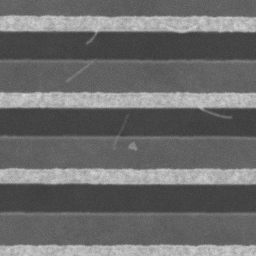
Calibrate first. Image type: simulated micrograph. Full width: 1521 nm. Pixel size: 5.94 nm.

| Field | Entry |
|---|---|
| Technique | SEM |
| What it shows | lines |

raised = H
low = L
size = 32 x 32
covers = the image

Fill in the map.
HHHHHHHHHHHHHHHHHHHHHHHHHHHHHHHH
HHHHHHHHHHHHHHHHHHHHHHHHHHHHHHHH
HHHHHHHHHHHHHHHHHHHHHHHHHHHHHHHH
HHHHHHHHHHHHHHHHHHHHHHHHHHHHHHHH
LLLLLLLLLLLLLLLLLLLLLLLLLLLLLLLL
LLLLLLLLLLLLLLLLLLLLLLLLLLLLLLLL
LLLLLLLLLLLLLLLLLLLLLLLLLLLLLLLL
LLLLLLLLLLLLLLLLLLLLLLLLLLLLLLLL
HHHHHHHHHHHHHHHHHHHHHHHHHHHHHHHH
HHHHHHHHHHHHHHHHHHHHHHHHHHHHHHHH
HHHHHHHHHHHHHHHHHHHHHHHHHHHHHHHH
HHHHHHHHHHHHHHHHHHHHHHHHHHHHHHHH
HHHHHHHHHHHHHHHHHHHHHHHHHHHHHHHH
LLLLLLLLLLLLLLLLLLLLLLLLLHLLLLLL
LLLLLLLLLLLLLLLLLLLLLLLLLLLLLLLL
LLLLLLLLLLLLLLLLLLLLLLLLLLLLLLLL
LLLLLLLLLLLLLLLLLLLLLLLLLLLLLLLL
HHHHHHHHHHHHHHHHHHHHHHHHHHHHHHHH
HHHHHHHHHHHHHHHHHHHHHHHHHHHHHHHH
HHHHHHHHHHHHHHHHHHHHHHHHHHHHHHHH
HHHHHHHHHHHHHHHHHHHHHHHHHHHHHHHH
HHHHHHHHHHHHHHHHHHHHHHHHHHHHHHHH
HHHHHHHHHHHHHHHHHHHHHHHHHHHHHHHH
LLLLLLLLLLLLLLLLLLLLLLLLLLLLLLLL
LLLLLLLLLLLLLLLLLLLLLLLLLLLLLLLL
LLLLLLLLLLLLLLLLLLLLLLLLLLLLLLLL
LLLLLLLLLLLLLLLLLLLLLLLLLLLLLLLL
HHHHHHHHHHHHHHHHHHHHHHHHHHHHHHHH
HHHHHHHHHHHHHHHHHHHHHHHHHHHHHHHH
HHHHHHHHHHHHHHHHHHHHHHHHHHHHHHHH
HHHHHHHHHHHHHHHHHHHHHHHHHHHHHHHH
HHHHHHHHHHHHHHHHHHHHHHHHHHHHHHHH